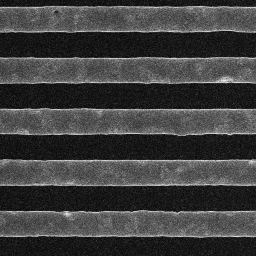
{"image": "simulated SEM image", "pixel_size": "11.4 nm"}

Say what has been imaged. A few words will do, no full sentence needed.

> parallel lines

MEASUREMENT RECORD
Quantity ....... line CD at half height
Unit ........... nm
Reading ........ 287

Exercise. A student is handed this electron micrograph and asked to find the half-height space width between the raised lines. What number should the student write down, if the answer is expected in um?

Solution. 0.299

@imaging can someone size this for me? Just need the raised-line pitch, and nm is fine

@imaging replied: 583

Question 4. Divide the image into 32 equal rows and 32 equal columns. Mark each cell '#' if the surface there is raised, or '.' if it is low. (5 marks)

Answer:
................................
################################
################################
################################
................................
................................
................................
################################
################################
################################
................................
................................
................................
................................
################################
################################
################################
................................
................................
................................
################################
################################
################################
................................
................................
................................
#######.###.#########...###.####
################################
################################
..#........#.........#.#####.#.#
................................
................................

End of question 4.